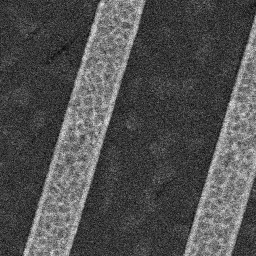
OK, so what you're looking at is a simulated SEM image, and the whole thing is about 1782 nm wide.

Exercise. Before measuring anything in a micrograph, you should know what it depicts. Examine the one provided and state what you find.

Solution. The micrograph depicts one or a few lines or trenches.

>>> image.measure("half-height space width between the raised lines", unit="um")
0.803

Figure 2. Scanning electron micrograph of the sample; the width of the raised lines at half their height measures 266 nm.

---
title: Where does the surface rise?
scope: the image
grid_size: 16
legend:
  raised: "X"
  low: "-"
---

------XXX-------
------XX--------
------XX--------
-----XXX-------X
-----XXX-------X
-----XX--------X
-----XX--------X
----XXX-------XX
----XX--------XX
----XX--------XX
---XXX-------XXX
---XX--------XXX
---XX--------XX-
--XXX-------XXX-
--XXX-------XXX-
--XX--------XX--